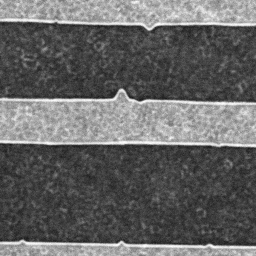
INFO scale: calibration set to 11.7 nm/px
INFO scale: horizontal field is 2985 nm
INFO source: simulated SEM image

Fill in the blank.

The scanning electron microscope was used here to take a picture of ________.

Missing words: one or a few lines or trenches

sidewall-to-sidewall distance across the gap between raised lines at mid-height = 1050 nanometers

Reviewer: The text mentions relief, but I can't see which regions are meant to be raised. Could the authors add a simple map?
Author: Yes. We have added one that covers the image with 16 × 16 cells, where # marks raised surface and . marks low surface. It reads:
################
........##.....#
................
................
................
................
###############.
################
################
................
................
................
................
................
................
###############.